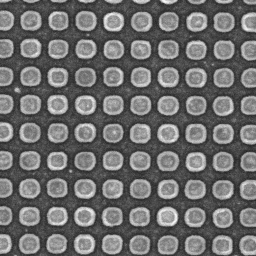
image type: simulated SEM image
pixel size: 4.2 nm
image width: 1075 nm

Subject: a regular array of raised bodies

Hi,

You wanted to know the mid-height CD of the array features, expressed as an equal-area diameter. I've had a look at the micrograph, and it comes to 0.0785 µm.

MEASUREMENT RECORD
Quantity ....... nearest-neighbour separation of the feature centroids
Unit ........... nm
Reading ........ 115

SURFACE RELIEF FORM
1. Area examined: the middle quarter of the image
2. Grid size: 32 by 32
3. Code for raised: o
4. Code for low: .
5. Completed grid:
................................
....ooo....ooo....ooo....oo.....
o..ooooo..ooooo..oooo...oooo...o
o..ooooo..ooooo..oooo...oooo...o
...oooo...oooo...oooo...oooo...o
................................
................................
................................
....ooo....ooo....ooo....ooo....
o..ooooo..oooo...oooo...oooo...o
o..ooooo..oooo...oooo...oooo...o
....ooo...oooo...oooo...oooo...o
................................
................................
................................
....ooo....ooo....oo.....oo.....
o..oooo...oooo...oooo...oooo...o
o..oooo...oooo...oooo...oooo...o
...oooo...oooo...oooo...oooo...o
..........................o.....
................................
................................
....ooo....ooo....ooo....ooo....
...oooo...oooo...oooo...oooo...o
...oooo...oooo...oooo...oooo...o
...oooo...oooo...oooo...oooo...o
................................
................................
................................
....ooo....ooo....ooo....oo....o
...ooooo..oooo...oooo...oooo...o
...oooo...oooo...oooo...oooo...o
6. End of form